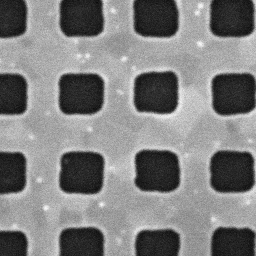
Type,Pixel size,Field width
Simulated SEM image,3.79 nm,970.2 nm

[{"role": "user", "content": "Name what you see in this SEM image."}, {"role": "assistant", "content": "holes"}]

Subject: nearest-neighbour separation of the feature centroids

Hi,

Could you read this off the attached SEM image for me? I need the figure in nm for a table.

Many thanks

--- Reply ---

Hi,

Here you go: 287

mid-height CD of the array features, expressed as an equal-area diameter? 0.183 microns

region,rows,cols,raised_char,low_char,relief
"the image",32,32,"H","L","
LLLHHHHLLLLLLHHHHLLLLLHHHHLLLLLL
LLLLHHHLLLLLLHHHHLLLLLHHHHLLLLLL
LLLHHHHLLLLLLHHHHLLLLLHHHHLLLLLL
LLLHHHHLLLLLLHHHHLLLLLHHHHLLLLLL
LLLHHHHHLLLLHHHHHLLLLLHHHHHLLLLH
HHHHHHHHHHHHHHHHHHHHHHHHHHHHHHHH
HHHHHHHHHHHHHHHHHHHHHHHHHHHHHHHH
HHHHHHHHHHHHHHHHHHHHHHHHHHHHHHHH
HHHHHHHHHHHHHHHHHHHHHHHHHHHHHHHH
LLLHHHHHLLLLLHHHHLLLLLHHHHHLLLLL
LLLLHHHLLLLLLHHHHLLLLLHHHHLLLLLL
LLLLHHHLLLLLLHHHHLLLLLHHHHLLLLLL
LLLLHHHLLLLLLHHHHLLLLLHHHHLLLLLL
LLLHHHHLLLLLLHHHHLLLLLHHHHHLLLLL
LLHHHHHHHHLHHHHHHHHHHHHHHHHHLHHH
HHHHHHHHHHHHHHHHHHHHHHHHHHHHHHHH
HHHHHHHHHHHHHHHHHHHHHHHHHHHHHHHH
HHHHHHHHHHHHHHHHHHHHHHHHHHHHHHHH
HHHHHHHHHHHHHHHHHHHHHHHHHHHHHHHH
LLLHHHHHLLLLLHHHHLLLLLHHHHLLLLLL
LLLHHHHHLLLLLHHHHLLLLLHHHHLLLLLL
LLLHHHHLLLLLLHHHHLLLLLLHHHLLLLLL
LLLHHHHLLLLLLHHHHLLLLLLHHHLLLLLL
LLLHHHHLLLLLLHHHHLLLLLHHHHLLLLLL
HHHHHHHHHHHHHHHHHHHHHHHHHHHHHHHH
HHHHHHHHHHHHHHHHHHHHHHHHHHHHHHHH
HHHHHHHHHHHHHHHHHHHHHHHHHHHHHHHH
HHHHHHHHHHHHHHHHHHHHHHHHHHHHHHHH
HHHHHHHHLLLLHHHHHHHHHHHHHHHLLLLH
LLLHHHHLLLLLLHHHHLLLLLLHHHLLLLLL
LLLLHHHLLLLLLHHHHLLLLLLHHHLLLLLL
LLLHHHHLLLLLLHHHHLLLLLHHHHLLLLLL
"